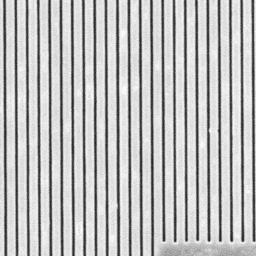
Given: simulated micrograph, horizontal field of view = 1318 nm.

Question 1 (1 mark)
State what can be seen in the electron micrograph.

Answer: parallel lines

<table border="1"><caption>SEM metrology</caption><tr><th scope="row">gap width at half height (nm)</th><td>18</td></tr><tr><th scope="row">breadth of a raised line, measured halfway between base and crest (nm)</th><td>40.6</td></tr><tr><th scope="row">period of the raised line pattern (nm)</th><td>58.2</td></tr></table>